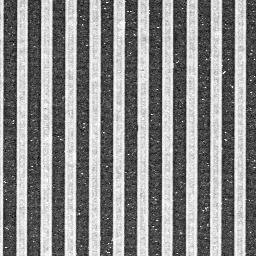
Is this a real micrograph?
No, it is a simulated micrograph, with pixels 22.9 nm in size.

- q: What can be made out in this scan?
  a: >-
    parallel lines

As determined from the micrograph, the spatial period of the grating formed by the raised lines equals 554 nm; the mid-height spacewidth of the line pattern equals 366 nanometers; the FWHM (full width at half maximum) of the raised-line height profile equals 203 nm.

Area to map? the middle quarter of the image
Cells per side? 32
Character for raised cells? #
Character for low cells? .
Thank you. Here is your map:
.##....##....##....##....##....#
.##....##....##....##....##....#
.##....##....##....##....##....#
.##....##....##....##....##....#
.##....##....##....##....##....#
.##....##....##....##....##....#
.##....##....##....##....##....#
.##....##....##....##....##....#
.##....##....##....##....##....#
.##....##....##....##....##....#
.##....##....##....##....##....#
.##....##....##....##....##....#
.##....##....##....##....##....#
.##....##....##....##....##....#
.##....##....##....##....##....#
.##....##....##....##....##....#
.##....##....##....##....##....#
.##....##....##....##....##....#
.##....##....##....##....##....#
.##....##....##....##....##....#
.##....##....##....##....##....#
.##....##....##....##....##....#
.##....##....##....##....##....#
.##....##....##....##....##....#
.##....##....##....##....##....#
.##....##....##....##....##....#
.##....##....##....##....##....#
.##....##....##....##....##....#
.##....##....##....##....##....#
.##....##....##....##....##....#
.##....##....##....##....##....#
.#.....##....##....##....##....#